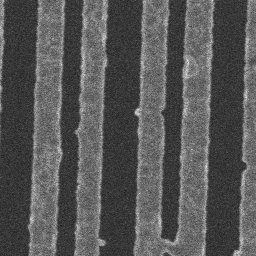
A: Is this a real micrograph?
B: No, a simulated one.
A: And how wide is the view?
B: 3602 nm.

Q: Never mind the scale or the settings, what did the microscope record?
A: parallel lines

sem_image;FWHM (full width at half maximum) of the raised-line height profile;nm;360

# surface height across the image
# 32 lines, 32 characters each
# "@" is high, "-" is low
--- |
-----@@@---@@-----@@@--@@@@----@
-----@@@--@@@-----@@@--@@@@----@
-----@@@--@@@-----@@@--@@@-----@
-----@@@--@@@-----@@@--@@@-----@
-----@@@--@@@-----@@@--@@@-----@
-----@@@--@@@-----@@@--@@@-----@
-----@@@--@@@-----@@@--@@@-----@
-----@@@--@@@-----@@@--@@@-----@
-----@@@--@@@-----@@@--@@@-----@
-----@@@--@@@-----@@@--@@@-----@
-----@@@--@@@-----@@@--@@@-----@
----@@@@--@@@-----@@@--@@@-----@
----@@@@--@@@-----@@@--@@@----@@
----@@@@--@@@----@@@---@@@----@@
----@@@---@@@----@@@---@@@-----@
----@@@---@@@----@@@---@@@----@@
----@@@---@@@----@@@@--@@@----@@
----@@@---@@@----@@@@--@@@----@@
----@@@@--@@@----@@@---@@@----@@
----@@@@--@@@----@@@---@@@----@@
----@@@---@@@----@@@---@@@-----@
----@@@---@@@----@@@---@@@-----@
----@@@---@@@----@@@---@@@----@@
----@@@---@@-----@@@---@@@----@@
----@@@---@@-----@@@---@@@----@@
----@@@---@@-----@@@--@@@@----@@
----@@@---@@-----@@@--@@@@----@@
----@@@---@@-----@@@--@@@@----@@
----@@@---@@-----@@@--@@@@----@@
----@@@---@@-----@@@--@@@@----@@
----@@@--@@@@----@@@@@@@@@----@@
----@@@--@@@-----@@@@@@@@@---@@@